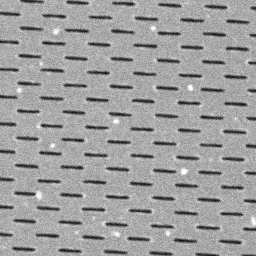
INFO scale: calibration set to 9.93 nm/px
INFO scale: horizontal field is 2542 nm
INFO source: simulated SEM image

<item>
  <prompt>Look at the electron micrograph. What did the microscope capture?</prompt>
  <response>a regular array of holes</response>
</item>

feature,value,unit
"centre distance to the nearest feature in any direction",0.261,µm